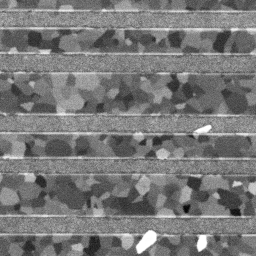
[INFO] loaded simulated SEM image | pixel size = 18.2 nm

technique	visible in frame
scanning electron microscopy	lines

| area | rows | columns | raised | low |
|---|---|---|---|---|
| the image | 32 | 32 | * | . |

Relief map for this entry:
********************************
................................
................................
................................
********************************
********************************
********************************
................................
................................
********************************
********************************
********************************
********************************
********************************
................................
................................
................................
********************************
********************************
********************************
................................
................................
********************************
********************************
********************************
********************************
********************************
................................
................................
********************************
********************************
********************************